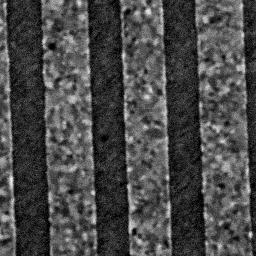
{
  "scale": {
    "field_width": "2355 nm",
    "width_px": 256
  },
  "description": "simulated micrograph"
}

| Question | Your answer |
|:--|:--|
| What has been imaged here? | lines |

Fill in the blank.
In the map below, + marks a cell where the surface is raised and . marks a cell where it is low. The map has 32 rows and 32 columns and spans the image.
+....++++++....+++++.....+++++..
+....++++++....+++++.....+++++..
+....++++++....+++++.....+++++..
+....++++++....+++++.....+++++..
+....++++++....+++++.....+++++..
+....++++++....+++++.....+++++..
+.....+++++....++++++....++++++.
+.....+++++....++++++....++++++.
+.....+++++.....+++++....++++++.
+.....+++++.....+++++....++++++.
+.....+++++.....+++++....++++++.
+.....+++++.....+++++....++++++.
+.....+++++.....+++++....++++++.
+.....+++++.....+++++....++++++.
+.....+++++.....+++++....++++++.
+.....+++++.....+++++....++++++.
+.....+++++.....+++++....++++++.
+.....+++++.....+++++....++++++.
+.....++++++....+++++....++++++.
+.....++++++....+++++....++++++.
+.....++++++....+++++....++++++.
+.....++++++....+++++....++++++.
++....++++++....+++++....++++++.
++....++++++....+++++....++++++.
++....++++++....+++++....++++++.
++....++++++....+++++.....+++++.
++....++++++....+++++.....+++++.
++....++++++....+++++.....+++++.
++....++++++....+++++.....+++++.
++....++++++....+++++.....+++++.
++....++++++....+++++.....+++++.
++....++++++....+++++.....+++++.